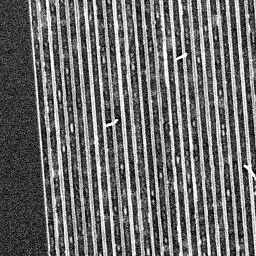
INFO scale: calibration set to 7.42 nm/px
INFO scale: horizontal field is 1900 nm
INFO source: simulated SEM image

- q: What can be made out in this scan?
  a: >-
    parallel lines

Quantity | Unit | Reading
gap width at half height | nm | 49.9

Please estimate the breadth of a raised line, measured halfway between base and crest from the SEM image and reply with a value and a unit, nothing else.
0.0213 µm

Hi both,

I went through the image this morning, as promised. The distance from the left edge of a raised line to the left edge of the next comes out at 69.9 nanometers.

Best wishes